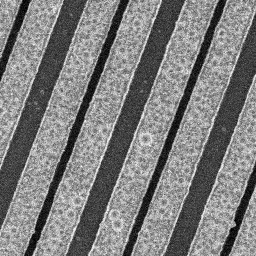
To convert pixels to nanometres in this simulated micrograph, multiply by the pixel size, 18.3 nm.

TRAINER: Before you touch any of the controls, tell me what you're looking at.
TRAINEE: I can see parallel lines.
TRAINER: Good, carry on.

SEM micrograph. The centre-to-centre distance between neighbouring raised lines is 832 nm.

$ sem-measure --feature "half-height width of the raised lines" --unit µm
0.544